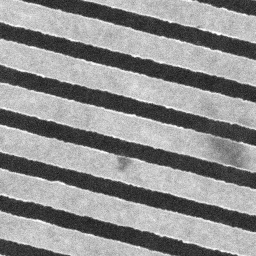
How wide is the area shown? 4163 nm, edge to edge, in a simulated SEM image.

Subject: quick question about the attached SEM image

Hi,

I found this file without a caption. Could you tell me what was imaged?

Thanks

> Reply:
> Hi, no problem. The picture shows parallel lines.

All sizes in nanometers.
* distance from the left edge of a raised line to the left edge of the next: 681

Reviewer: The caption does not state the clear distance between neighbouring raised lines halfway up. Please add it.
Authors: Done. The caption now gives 16.6 pixels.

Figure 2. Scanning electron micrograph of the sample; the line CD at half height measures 410 nm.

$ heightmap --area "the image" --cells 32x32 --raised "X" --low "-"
XXXX---------XXXXXXXXXXXXX------
XXXXXXXX---------XXXXXXXXXXXX---
XXXXXXXXXXXX--------XXXXXXXXXXXX
---XXXXXXXXXXXXX---------XXXXXXX
-------XXXXXXXXXXXXX--------XXXX
XXX--------XXXXXXXXXXXXX--------
XXXXXX---------XXXXXXXXXXXXX----
XXXXXXXXXX---------XXXXXXXXXXXX-
--XXXXXXXXXXXX---------XXXXXXXXX
-----XXXXXXXXXXXXX---------XXXXX
X--------XXXXXXXXXXXXX---------X
XXXXX---------XXXXXXXXXXXX------
XXXXXXXXX--------XXXXXXXXXXXXX--
XXXXXXXXXXXXX--------XXXXXXXXXXX
----XXXXXXXXXXXXX--------XXXXXXX
--------XXXXXXXXXXXXX---------XX
XXX---------XXXXXXXXXXXXX-------
XXXXXXX--------XXXXXXXXXXXXXX---
XXXXXXXXXXX---------XXXXXXXXXXXX
--XXXXXXXXXXXXX---------XXXXXXXX
------XXXXXXXXXXXXX---------XXXX
X---------XXXXXXXXXXXXX---------
XXXXXX--------XXXXXXXXXXXXX-----
XXXXXXXXXX--------XXXXXXXXXXXXX-
-XXXXXXXXXXXX---------XXXXXXXXXX
-----XXXXXXXXXXXX---------XXXXXX
---------XXXXXXXXXXXX---------XX
XXXXX--------XXXXXXXXXXXXX------
XXXXXXXX---------XXXXXXXXXXXX---
XXXXXXXXXXXX--------XXXXXXXXXXXX
---XXXXXXXXXXXXX--------XXXXXXXX
-------XXXXXXXXXXXXX--------XXXX